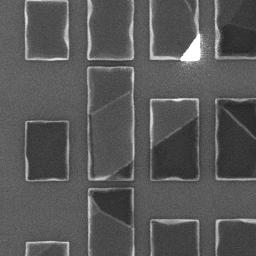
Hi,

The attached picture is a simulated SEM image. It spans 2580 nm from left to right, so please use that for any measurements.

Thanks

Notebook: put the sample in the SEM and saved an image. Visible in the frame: wiring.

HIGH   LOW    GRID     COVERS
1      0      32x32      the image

00011111000111111001111110011111
00011111000111111001111110011111
00011111000111111001111110011111
00011111000111110001111110011111
00011111000111110001111110011111
00011111000111111001111110011111
00011111100111110001111110011111
00000000000000000000000000000000
00000000000111110000000000000000
00000000000111111000000000000000
00000000000111111000000000000000
00000000000111111000000000000000
00000000000111111001111100011111
00000000000111111001111110011111
00000000000111111001111110011111
00011111100111111001111110011111
00011111100111111001111110011111
00011111000111111001111110011111
00011111000111111001111110011111
00011111000111111001111110011111
00011111100111111001111110011111
00011111100111111001111110011111
00001101000000000001000100000000
00000000000000000000000000000000
00000000000111111000000000000000
00000000000111111000000000000000
00000000000111111000000000000000
00000000000111111001000000001110
00000000000111111001111110011111
00000000000111111001111110011111
00001111000111111001111110011111
00011111000111111001111110011111